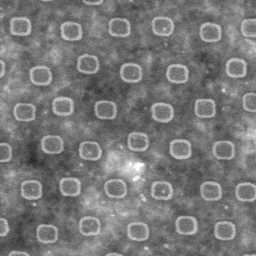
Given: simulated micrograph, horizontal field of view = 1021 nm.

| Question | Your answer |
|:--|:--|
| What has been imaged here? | a regular array of raised bodies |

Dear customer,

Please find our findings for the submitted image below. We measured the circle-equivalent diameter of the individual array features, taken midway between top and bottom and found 77.2 nanometres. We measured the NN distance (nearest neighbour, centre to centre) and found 167 nanometres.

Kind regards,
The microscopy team